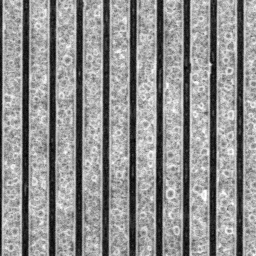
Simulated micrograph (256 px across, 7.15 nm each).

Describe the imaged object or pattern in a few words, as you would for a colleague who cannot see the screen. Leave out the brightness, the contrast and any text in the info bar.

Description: parallel lines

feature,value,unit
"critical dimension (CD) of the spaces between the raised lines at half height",0.0545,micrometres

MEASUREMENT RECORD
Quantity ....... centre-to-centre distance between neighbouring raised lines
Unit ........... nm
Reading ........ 192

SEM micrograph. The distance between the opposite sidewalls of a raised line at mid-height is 134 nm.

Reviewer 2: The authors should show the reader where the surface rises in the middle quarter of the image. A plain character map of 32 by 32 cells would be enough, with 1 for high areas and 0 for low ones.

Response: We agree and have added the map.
11100111100011110011111001111100
11100111100011110011111001111100
11100111100011110011111001111100
11100111100011110011111001111100
11100111100011110011111001111100
11100111100011110011111001111000
11100111100011110011111001111000
11100111100011110011111001111000
11100111100011110011111001111000
11100111100011110011111001111000
11100111100011110011111001111000
11100111100111110011111001111100
11100111100111110011111001111100
11100111100111110011111001111100
11100111100011110011111001111100
11100111100011110011111001111100
11100111100011110011111001111100
11100111100011110011111001111000
11100111100011110011111001111000
11100111100011110011111001111000
11100111100011110011111001111000
11100111100011110011111001111000
11100111100011110011111001111000
11100111100011110011111001111100
11100111100011110011111001111100
11100111100011110011111001111100
11100111100011110011111001111100
11100111100011110011111001111100
11100111100011110011111001111100
11100111100011110011111001111100
11100111100011110011111001111100
11100111100011110011111001111100